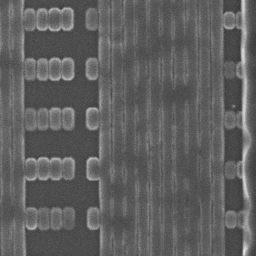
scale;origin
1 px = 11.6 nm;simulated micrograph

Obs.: wiring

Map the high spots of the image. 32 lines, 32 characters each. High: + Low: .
+++.........++++++++++++++++..++
+++++++++..+++++++++++++++++..++
+++++++++..+++++++++++++++++++++
+++..++++..++++++++++++++++++.++
+++.........++++++++++++++++..++
+++.........++++++++++++++++..++
+++.........++++++++++++++++..++
+++..+..+..+++++++++++++++++..++
+++++++++..+++++++++++++++++..++
+++++++++..+++++++++++++++++..++
+++..........+++++++++++++++..++
+++..........+++++++++++++++..++
+++.........++++++++++++++++..++
+++.........++++++++++++++++..++
+++++++++..+++++++++++++++++++++
+++++++++..+++++++++++++++++++++
+++..........+++++++++++++++..++
+++..........+++++++++++++++..++
+++..........+++++++++++++++..++
+++.........++++++++++++++++..++
+++++++++..+++++++++++++++++..++
+++++++++..+++++++++++++++++++++
+++.........++++++++++++++++..++
+++.........++++++++++++++++..++
+++.........++++++++++++++++..++
+++..........+++++++++++++++...+
++++++.++..+++++++++++++++++..++
+++++++++..+++++++++++++++++++++
+++..+.....+++++++++++++++++..++
+++..........+++++++++++++++...+
+++..........+++++++++++++++..++
+++..........+++++++++++++++..++